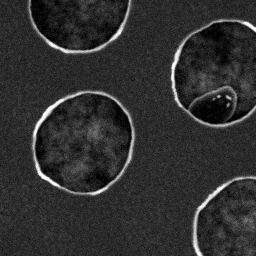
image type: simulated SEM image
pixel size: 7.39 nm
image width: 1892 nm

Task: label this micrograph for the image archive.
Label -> holes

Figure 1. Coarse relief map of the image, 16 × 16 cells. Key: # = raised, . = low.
##......########
##......#####..#
###....#####....
###########.....
###########.....
###########.....
####...####.....
###.....#####..#
##......########
##......########
##......########
####...#######..
#############...
############....
############....
############....